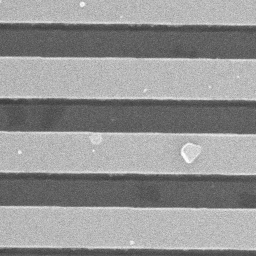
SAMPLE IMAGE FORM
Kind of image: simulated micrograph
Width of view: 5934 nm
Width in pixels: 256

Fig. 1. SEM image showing lines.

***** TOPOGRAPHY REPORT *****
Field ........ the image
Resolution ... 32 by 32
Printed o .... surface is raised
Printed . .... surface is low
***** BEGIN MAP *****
oooooooooooooooooooooooooooooooo
oooooooooooooooooooooooooooooooo
oooooooooooooooooooooooooooooooo
................................
................................
................................
................................
oooooooooooooooooooooooooooooooo
oooooooooooooooooooooooooooooooo
oooooooooooooooooooooooooooooooo
oooooooooooooooooooooooooooooooo
oooooooooooooooooooooooooooooooo
..............................oo
................................
................................
................................
o.o.............................
oooooooooooooooooooooooooooooooo
oooooooooooooooooooooooooooooooo
oooooooooooooooooooooooooooooooo
oooooooooooooooooooooooooooooooo
......oooooooooooooooooooooooooo
................................
................................
................................
................................
oooooooooooooooooooooooooooooooo
oooooooooooooooooooooooooooooooo
oooooooooooooooooooooooooooooooo
oooooooooooooooooooooooooooooooo
oooooooooooooooooooooooooooooooo
................................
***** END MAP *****